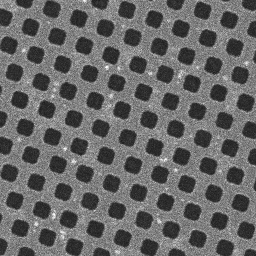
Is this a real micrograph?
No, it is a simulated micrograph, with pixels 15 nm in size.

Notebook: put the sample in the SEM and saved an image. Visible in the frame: a regular array of holes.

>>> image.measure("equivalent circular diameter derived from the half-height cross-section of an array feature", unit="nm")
273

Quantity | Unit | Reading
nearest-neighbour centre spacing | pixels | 27.8